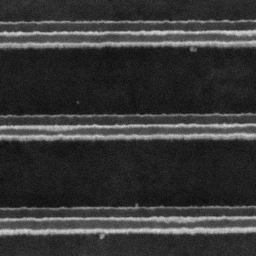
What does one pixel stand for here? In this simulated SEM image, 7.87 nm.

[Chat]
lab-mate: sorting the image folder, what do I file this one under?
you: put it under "lines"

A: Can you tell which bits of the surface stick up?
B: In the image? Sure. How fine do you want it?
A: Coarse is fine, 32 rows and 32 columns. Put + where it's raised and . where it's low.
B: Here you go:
................................
................................
................................
++++++++++++++++++++++++++++++++
++++++++++++++++++++++++++++++++
+++++++++++++.++...+............
................................
................................
................................
................................
................................
................................
................................
................................
.+.+++++++++++++++++++++++++++++
++++++++++++++++++++++++++++++++
++++++++++++++++++++++++++++++++
................................
................................
................................
................................
................................
................................
................................
................................
................................
++++++++++++++++++++++++++++++++
++++++++++++++++++++++++++++++++
++++++++++++++++++++++++++++++++
................................
................................
................................